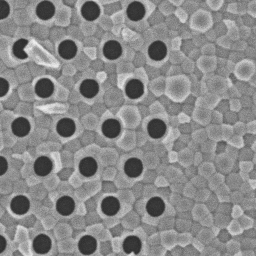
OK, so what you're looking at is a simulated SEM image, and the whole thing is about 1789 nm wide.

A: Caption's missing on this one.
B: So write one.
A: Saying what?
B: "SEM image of a regular array of holes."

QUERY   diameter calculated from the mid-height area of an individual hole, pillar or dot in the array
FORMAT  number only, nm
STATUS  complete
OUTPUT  142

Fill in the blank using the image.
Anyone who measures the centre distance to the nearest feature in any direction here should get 313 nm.